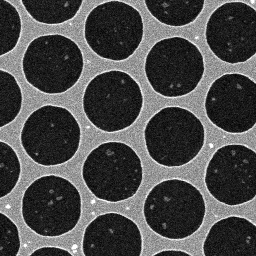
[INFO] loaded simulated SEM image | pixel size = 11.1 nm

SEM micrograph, a regular array of holes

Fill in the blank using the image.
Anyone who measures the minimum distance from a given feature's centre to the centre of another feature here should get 70.3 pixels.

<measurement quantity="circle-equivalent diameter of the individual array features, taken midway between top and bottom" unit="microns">0.667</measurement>